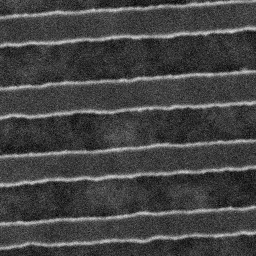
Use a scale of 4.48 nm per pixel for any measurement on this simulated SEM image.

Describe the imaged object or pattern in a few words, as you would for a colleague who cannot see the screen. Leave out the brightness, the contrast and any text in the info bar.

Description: lines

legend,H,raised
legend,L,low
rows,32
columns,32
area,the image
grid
LLLLLLLLLLLLLLLLLLLLLLLLHHHHHHHH
LLLLLLLHLLHHHHHHHHHHHHHHHHHHHHHH
HHHHHHHHHHHHHHHHHHHHHHHHHHHHHHHH
HHHHHHHHHHHHHHHHHHHHHHHHHHHHHHHH
HHHHHHHHHHHHHHHHHHHHHHLLLLLLLLLL
HHHHLLLLLLLLLLLLLLLLLLLLLLLLLLLL
LLLLLLLLLLLLLLLLLLLLLLLLLLLLLLLL
LLLLLLLLLLLLLLLLLLLLLLLLLLLLLLLL
LLLLLLLLLLLLLLLLLLLLLLLLLLLLLLLL
LLLLLLLLLLLLLLLLLLLLLLHHHHHHHHHH
LLLLLLHHHHHHHHHHHHHHHHHHHHHHHHHH
HHHHHHHHHHHHHHHHHHHHHHHHHHHHHHHH
HHHHHHHHHHHHHHHHHHHHHHHHHHHHHHHH
HHHHHHHHHHHHHHHHHHHHHHLLLLLLLLLL
HHHHHHLLLLLLLLLLLLLLLLLLLLLLLLLL
LLLLLLLLLLLLLLLLLLLLLLLLLLLLLLLL
LLLLLLLLLLLLLLLLLLLLLLLLLLLLLLLL
LLLLLLLLLLLLLLLLLLLLLLLLLLLLLLLL
LLLLLLLLLLLLLLLLLHHHHHHHHHHHHHHH
HHHHHHHHHHHHHHHHHHHHHHHHHHHHHHHH
HHHHHHHHHHHHHHHHHHHHHHHHHHHHHHHH
HHHHHHHHHHHHHHHHHHHHHHHHHLLLLLLL
HHHHHHHHHHLLLLLLLLLLLLLLLLLLLLLL
LLLLLLLLLLLLLLLLLLLLLLLLLLLLLLLL
LLLLLLLLLLLLLLLLLLLLLLLLLLLLLLLL
LLLLLLLLLLLLLLLLLLLLLLLLLLLLLLLL
LLLLLLLLLLLLLLLLLLLLLHHHHHHHHHHH
LLLLLLLHHHHHHHHHHHHHHHHHHHHHHHHH
HHHHHHHHHHHHHHHHHHHHHHHHHHHHHHHH
HHHHHHHHHHHHHHHHHHHHHHHHHHHHLLLL
HHHHHHHHHHLLLLLLLLLLLLLLLLLLLLLL
LLLLLLLLLLLLLLLLLLLLLLLLLLLLLLLL